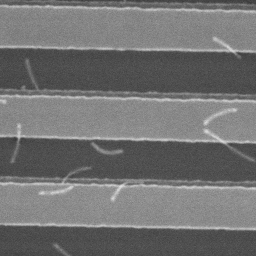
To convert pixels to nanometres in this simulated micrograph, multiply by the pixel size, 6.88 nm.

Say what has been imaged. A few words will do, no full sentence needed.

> lines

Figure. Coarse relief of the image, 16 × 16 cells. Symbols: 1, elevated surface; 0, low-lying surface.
1111111110000000
1111111111111111
1111111111111111
0000000000000000
0000000000000000
0000000000000000
1111111111111111
1111111111111111
1111111111111111
0000000000000000
0000000000000000
1111100000000000
1111111111111111
1111111111111111
0000000000000000
0000000000000000